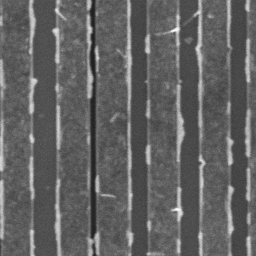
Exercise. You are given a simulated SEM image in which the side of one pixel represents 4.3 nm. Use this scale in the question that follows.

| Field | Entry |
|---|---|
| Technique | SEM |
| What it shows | parallel lines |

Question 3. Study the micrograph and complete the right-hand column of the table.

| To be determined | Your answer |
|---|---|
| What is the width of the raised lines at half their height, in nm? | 144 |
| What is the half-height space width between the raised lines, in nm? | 75.3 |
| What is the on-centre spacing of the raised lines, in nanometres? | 204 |